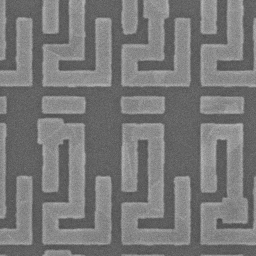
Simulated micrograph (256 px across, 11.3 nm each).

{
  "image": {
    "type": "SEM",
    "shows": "wiring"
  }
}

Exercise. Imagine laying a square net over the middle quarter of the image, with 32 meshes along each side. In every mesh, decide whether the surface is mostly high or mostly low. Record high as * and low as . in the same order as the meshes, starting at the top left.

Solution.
........***....***..........***.
........***....***..........***.
************...****************.
************...****************.
***********....****************.
................................
................................
................................
***............**********.......
*****..........**********.......
*****..........**********.......
*****..........**********.......
................................
................................
................................
*****..........**********.......
*****..........**********.......
*****..........**********.......
*****..........**********.......
.****..........***...****.......
..***..........***...****.......
.****..........***...****.......
.****..........***...****.......
.****..........***...****.......
.****..........***...****.......
.****..........***...****.......
..***..........***...****.......
..***..........***...****.......
..***...***....***...****...***.
..***...***....***...****...***.
.****...****...***...****...***.
.****...****...***...****...***.